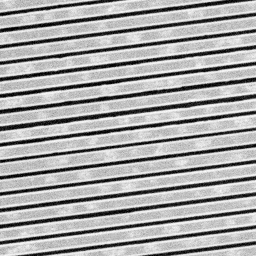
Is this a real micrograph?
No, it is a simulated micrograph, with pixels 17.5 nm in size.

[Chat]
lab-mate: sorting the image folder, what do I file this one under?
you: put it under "parallel lines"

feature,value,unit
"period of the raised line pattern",284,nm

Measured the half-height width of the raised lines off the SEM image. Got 176 nm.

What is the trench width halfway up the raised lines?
5.58 px